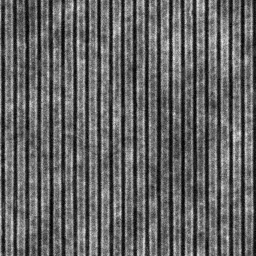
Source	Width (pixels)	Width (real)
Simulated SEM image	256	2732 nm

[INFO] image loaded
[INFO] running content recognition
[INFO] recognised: parallel lines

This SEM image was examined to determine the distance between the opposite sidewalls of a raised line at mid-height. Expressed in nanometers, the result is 72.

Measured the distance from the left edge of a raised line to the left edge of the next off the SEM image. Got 128 nanometres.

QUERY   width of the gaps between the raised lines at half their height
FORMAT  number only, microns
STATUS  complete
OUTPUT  0.0533